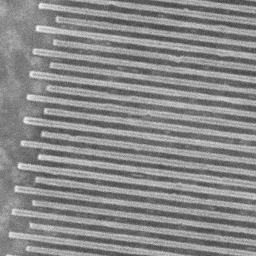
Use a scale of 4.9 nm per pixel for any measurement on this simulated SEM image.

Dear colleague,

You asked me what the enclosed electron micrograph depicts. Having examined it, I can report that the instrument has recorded parallel lines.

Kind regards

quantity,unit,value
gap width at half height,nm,33.4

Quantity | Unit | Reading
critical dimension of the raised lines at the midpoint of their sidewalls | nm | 24.9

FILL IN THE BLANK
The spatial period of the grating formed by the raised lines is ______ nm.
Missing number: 56.6